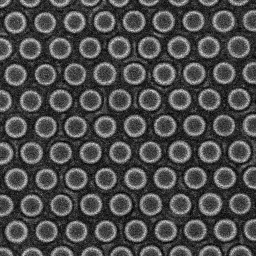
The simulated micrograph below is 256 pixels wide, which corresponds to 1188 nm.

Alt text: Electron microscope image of a regular array of raised bodies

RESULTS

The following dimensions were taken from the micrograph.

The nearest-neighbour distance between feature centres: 137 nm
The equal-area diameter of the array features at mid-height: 95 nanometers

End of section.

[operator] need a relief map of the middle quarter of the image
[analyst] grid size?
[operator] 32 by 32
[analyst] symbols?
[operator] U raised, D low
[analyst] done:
DUUUDDDDDUUUDDDDUUUDDDDDUUUDDDDU
DUUUUDDDUUUUUDDUUUUUDDDUUUUDDDUU
UUUUUDDDUUUUUDDUUUUUDDDUUUUDDDUU
UUUUUDDDUUUUUDDUUUUUDDDUUUUDDDUU
DUUUUDDDUUUUDDDDUUUDDDDDUUUDDDDU
DDDDDDDDDDDDDDDDDDDDDDDDDDDDDDDD
DDDDDDDDDDDDDDDDDDDDDDDDDDDDDDDD
UDDDDUUUDDDDUUUUDDDUUUUUDDDUUUUD
UUDDUUUUUDDDUUUUUDDUUUUUDDDUUUUD
UUDDUUUUUDDDUUUUUDDUUUUUDDDUUUUD
UDDDDUUUUDDDUUUUDDDUUUUUDDDUUUUD
DDDDDDUDDDDDDDDDDDDDDDDDDDDDDDDD
DDDDDDDDDDDDDDDDDDDDDDDDDDDDDDDD
DDUUDDDDDUUDDDDDUUUDDDDDUUUDDDDU
DUUUUDDDUUUUDDDUUUUUDDDUUUUUDDUU
UUUUUUDDUUUUUDDUUUUUDDDUUUUUDDUU
UUUUUDDDUUUUUDDDUUUUDDDUUUUUDDUU
DUUUUDDDDUUUDDDDUUUDDDDDUUUDDDDU
DDDDDDDDDDDDDDDDDDDDDDDDDDDDDDDD
DDDDDDDDDDDDDDDDDDDDDDDDDDDDDDDD
UDDDDUUUUDDDUUUUDDDUUUUUDDDUUUUD
UUDDUUUUUDDDUUUUDDDUUUUUDDUUUUUD
UUDDUUUUUDDDUUUUDDDUUUUUDDUUUUUD
UDDDUUUUUDDDUUUUDDDDUUUUDDDUUUUD
DDDDDDDDDDDDDDDDDDDDDUDDDDDDDDDD
DDDDDDDDDDDDDDDDDDDDDDDDDDDDDDDD
DDUUDDDDDUUDDDDDDUUDDDDUUUUDDDDU
DUUUUDDDUUUUUDDDUUUUDDDUUUUUDDUU
DUUUUUDDUUUUUDDUUUUUDDDUUUUUDDUU
DUUUUDDDUUUUUDDDUUUUDDDUUUUUDDUU
DUUUUDDDDUUUDDDDUUUUDDDDUUUDDDDU
DDDDDDDDDDDDDDDDDDDDDDDDDDDDDDDD